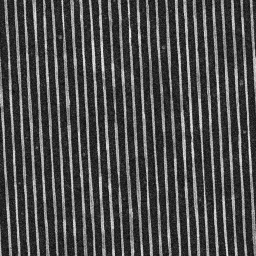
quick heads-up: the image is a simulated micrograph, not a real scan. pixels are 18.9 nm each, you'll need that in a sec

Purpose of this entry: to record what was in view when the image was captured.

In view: parallel lines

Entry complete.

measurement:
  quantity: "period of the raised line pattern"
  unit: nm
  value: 178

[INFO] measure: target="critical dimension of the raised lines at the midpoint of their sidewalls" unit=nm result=44.8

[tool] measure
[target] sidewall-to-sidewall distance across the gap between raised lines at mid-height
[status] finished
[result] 0.134 micrometres